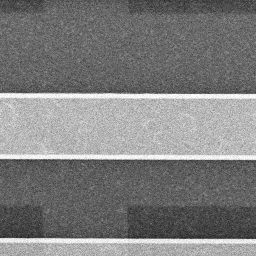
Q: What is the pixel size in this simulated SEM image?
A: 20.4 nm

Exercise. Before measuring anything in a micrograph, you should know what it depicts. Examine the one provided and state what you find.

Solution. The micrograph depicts one or a few lines or trenches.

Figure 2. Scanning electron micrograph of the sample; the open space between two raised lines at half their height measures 1.73 um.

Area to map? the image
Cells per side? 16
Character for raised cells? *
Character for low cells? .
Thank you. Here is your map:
................
................
................
................
................
................
****************
****************
****************
****************
................
................
................
................
................
****************